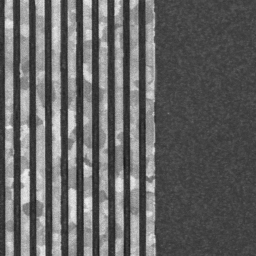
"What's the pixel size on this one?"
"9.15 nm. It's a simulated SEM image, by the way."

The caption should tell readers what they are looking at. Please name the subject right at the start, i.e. parallel lines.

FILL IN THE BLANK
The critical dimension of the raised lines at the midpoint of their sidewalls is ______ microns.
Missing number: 0.0732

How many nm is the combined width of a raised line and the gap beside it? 143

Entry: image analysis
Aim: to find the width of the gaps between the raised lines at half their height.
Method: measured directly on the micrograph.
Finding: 65.2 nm